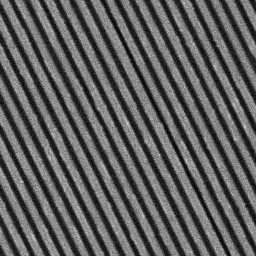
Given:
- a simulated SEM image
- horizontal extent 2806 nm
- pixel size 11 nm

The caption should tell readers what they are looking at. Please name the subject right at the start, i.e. parallel lines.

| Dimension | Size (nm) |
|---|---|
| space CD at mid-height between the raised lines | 65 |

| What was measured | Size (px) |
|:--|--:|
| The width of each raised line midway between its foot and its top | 7.96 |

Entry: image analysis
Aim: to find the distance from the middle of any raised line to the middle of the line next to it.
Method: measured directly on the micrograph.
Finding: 13.5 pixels